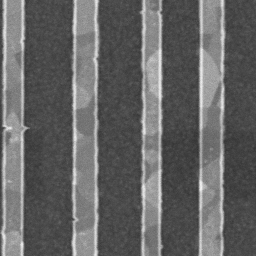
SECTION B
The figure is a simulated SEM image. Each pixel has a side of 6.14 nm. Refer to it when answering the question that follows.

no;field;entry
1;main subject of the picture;one or a few lines or trenches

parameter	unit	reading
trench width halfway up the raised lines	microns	0.293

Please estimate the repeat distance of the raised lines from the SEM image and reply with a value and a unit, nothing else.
405 nm